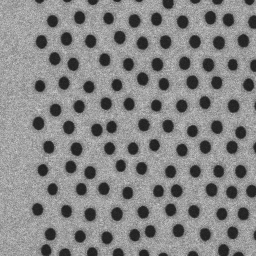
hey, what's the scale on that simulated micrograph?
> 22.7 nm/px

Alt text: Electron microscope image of a regular array of holes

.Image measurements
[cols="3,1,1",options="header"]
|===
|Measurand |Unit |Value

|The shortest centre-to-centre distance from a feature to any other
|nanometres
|487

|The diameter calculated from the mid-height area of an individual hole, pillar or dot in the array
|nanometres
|276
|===